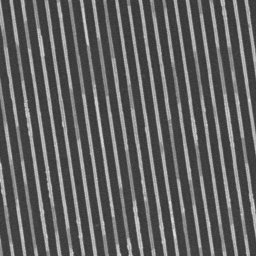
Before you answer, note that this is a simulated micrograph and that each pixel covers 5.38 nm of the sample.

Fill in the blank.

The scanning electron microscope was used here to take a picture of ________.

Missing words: parallel lines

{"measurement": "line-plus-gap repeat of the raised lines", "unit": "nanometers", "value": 62.6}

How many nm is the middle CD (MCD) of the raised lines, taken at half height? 13.3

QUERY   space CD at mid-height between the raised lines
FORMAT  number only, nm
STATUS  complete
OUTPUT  47.8